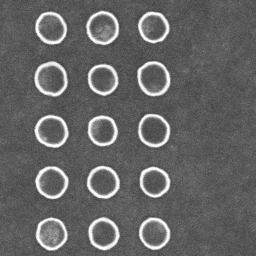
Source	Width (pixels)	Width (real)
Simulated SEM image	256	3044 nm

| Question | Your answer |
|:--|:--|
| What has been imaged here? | a regular array of raised bodies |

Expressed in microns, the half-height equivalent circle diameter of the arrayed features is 0.354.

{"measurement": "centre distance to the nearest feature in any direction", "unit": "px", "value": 50.9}